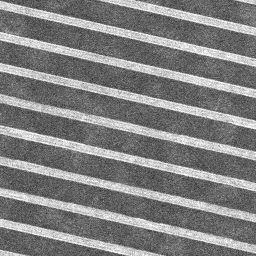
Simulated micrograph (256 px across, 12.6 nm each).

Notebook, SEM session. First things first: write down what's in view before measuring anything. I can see parallel lines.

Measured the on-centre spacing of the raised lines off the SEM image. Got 381 nm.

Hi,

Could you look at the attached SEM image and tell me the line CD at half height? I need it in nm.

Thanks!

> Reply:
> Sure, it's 84.4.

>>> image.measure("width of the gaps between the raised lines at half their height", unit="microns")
0.296